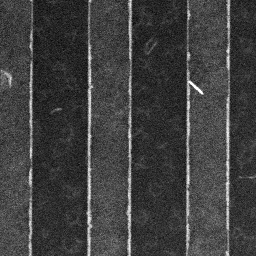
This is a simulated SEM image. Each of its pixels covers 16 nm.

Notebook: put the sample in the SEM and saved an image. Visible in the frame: one or a few lines or trenches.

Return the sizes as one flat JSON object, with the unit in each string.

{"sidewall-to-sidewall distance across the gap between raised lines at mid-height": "903 nm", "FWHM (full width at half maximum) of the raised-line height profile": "668 nanometres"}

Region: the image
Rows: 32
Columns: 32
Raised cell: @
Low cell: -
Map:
@@@@-------@@@@@-------@@@@@@---
@@@@-------@@@@@-------@@@@@@---
@@@@-------@@@@@-------@@@@@@---
@@@@-------@@@@@-------@@@@@@---
@@@@-------@@@@@-------@@@@@@---
@@@@-------@@@@@--@----@@@@@@---
@@@@-------@@@@@--@----@@@@@@---
@@@@-------@@@@@-------@@@@@@---
@@@@-------@@@@@-------@@@@@@---
@@@@-------@@@@@-------@@@@@@---
@@@@-------@@@@@-------@@@@@@---
@@@@-------@@@@@-------@@@@@@---
@@@@-------@@@@@--------@@@@@---
@@@@-------@@@@@-------@@@@@@---
@@@@-------@@@@@-------@@@@@@---
@@@@-------@@@@@-------@@@@@@---
@@@@-------@@@@@-------@@@@@@---
@@@@-------@@@@@-------@@@@@@---
@@@@---@---@@@@@-------@@@@@@---
@@@@-------@@@@@-------@@@@@@---
@@@@-------@@@@@-------@@@@@@---
@@@@-------@@@@@-------@@@@@@---
@@@@-------@@@@@-------@@@@@@---
@@@@-------@@@@@-------@@@@@@---
@@@@-------@@@@@-------@@@@@@---
@@@@-------@@@@@-------@@@@@@---
@@@@-------@@@@@-------@@@@@@---
@@@@-------@@@@@-------@@@@@@---
@@@@-------@@@@@-------@@@@@@---
@@@@-------@@@@@-------@@@@@----
@@@@-------@@@@@-------@@@@@@---
@@@@-------@@@@@-------@@@@@@---